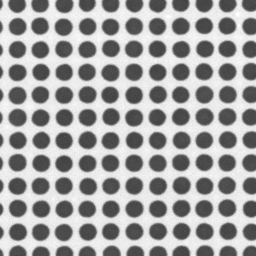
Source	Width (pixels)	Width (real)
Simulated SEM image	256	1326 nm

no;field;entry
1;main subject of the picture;a regular array of holes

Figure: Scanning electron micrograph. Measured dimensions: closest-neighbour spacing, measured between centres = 116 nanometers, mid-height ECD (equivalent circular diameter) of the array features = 90.2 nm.